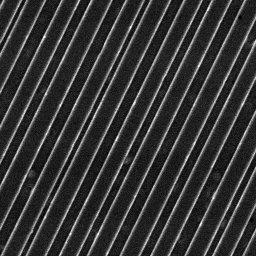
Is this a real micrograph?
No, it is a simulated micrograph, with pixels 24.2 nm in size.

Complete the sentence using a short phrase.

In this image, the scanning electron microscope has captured parallel lines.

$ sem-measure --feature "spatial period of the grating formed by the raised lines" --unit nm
666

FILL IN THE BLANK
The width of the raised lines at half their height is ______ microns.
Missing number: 0.426